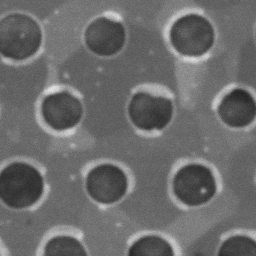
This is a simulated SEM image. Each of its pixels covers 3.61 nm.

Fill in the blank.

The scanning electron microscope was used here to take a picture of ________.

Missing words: holes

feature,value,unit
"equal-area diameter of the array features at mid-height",0.152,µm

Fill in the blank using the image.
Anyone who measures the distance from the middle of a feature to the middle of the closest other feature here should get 308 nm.